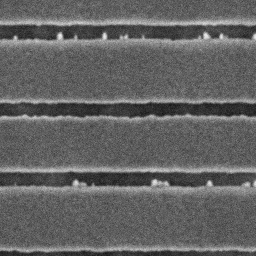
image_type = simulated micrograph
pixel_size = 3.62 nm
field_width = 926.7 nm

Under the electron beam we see lines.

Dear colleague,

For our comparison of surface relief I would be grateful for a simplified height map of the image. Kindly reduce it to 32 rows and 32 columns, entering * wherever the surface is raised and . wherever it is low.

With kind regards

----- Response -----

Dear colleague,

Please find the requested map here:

********************************
********************************
********************************
................................
................................
********************************
********************************
********************************
********************************
********************************
********************************
********************************
********************************
................................
......................**........
********************************
********************************
********************************
********************************
********************************
********************************
................................
................................
***********************..*******
********************************
********************************
********************************
********************************
********************************
********************************
********************************
...*............................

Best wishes